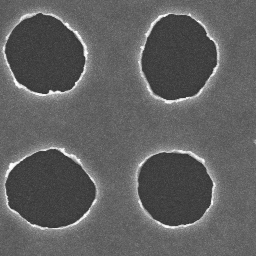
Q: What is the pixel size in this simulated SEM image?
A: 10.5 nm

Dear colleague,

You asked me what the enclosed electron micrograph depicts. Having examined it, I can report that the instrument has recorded holes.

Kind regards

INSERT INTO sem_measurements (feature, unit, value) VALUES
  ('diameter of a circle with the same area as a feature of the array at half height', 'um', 0.83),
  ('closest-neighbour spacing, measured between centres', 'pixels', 128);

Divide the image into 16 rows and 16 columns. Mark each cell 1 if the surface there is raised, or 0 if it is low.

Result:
1111111111111111
1000111111001111
0000011110000111
0000011110000011
1000011110000111
1100111110000111
1111111111111111
1111111111111111
1111111111111111
1100111111111111
1000011110000111
0000001110000111
0000001110000111
1000011110000111
1111111111111111
1111111111111111